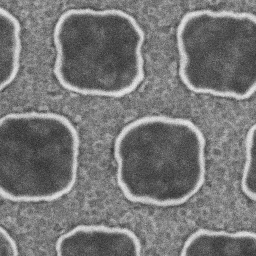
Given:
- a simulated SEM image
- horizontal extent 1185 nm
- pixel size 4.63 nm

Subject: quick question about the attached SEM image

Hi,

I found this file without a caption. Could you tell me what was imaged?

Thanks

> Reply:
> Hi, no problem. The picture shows raised bodies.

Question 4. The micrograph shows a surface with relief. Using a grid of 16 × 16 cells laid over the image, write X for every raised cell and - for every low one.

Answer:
----------------
X---XXXX---XXXXX
X---XXXXX--XXXXX
X---XXXXX--XXXXX
X---XXXXX--XXXXX
----XXXX----XXXX
----------------
XXXX-----XX-----
XXXXX---XXXXX---
XXXXX--XXXXXX--X
XXXXX--XXXXXX--X
XXXX----XXXX---X
---------XX-----
----------------
----XXXX--------
X---XXXXX---XXXX